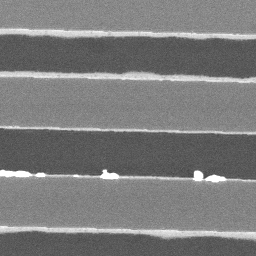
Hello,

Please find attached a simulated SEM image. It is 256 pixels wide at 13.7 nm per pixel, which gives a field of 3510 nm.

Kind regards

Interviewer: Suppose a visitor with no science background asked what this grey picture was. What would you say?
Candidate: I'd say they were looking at lines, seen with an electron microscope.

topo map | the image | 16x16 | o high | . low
oooooooooooooooo
oooooooooooooooo
................
................
................
oooooooooooooooo
oooooooooooooooo
oooooooooooooooo
................
................
................
oooooooooooooooo
oooooooooooooooo
oooooooooooooooo
..........oooooo
................